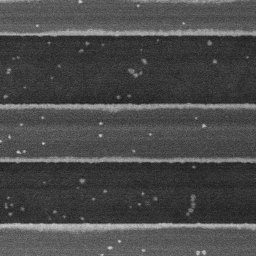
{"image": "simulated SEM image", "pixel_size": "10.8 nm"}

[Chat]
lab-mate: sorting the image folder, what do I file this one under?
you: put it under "lines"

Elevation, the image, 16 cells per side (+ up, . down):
++++++++++++++++
++++++++++++++++
................
................
................
................
................
++++++++++++++++
++++++++++++++++
++++++++++++++++
................
................
................
................
++++++++++++++++
++++++++++++++++